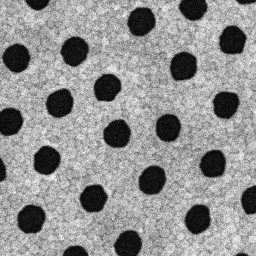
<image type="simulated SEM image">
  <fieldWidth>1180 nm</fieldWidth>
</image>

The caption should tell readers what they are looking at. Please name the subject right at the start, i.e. a regular array of holes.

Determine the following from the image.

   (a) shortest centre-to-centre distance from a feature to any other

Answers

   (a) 260 nanometres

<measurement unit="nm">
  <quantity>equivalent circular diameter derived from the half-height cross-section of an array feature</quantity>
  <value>128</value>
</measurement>